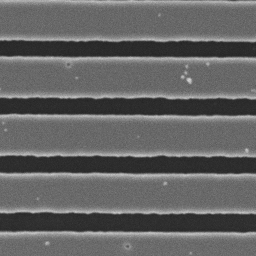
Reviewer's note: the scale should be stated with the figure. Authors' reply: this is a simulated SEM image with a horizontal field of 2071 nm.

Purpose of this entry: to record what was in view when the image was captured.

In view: lines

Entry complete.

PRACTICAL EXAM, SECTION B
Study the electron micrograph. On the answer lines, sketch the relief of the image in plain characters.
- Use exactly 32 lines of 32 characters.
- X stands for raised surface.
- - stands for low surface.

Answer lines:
XXXXXXXXXXXXXXXXXXXXXXXXXXXXXXXX
XXXXXXXXXXXXXXXXXXXXXXXXXXXXXXXX
XXXXXXXXXXXXXXXXXXXXXXXXXXXXXXXX
XXXXXXXXXXXXXXXXXXXXXXXXXXXXXXXX
XXXXXXXXXXXXXXXXXXXXXXXXXXXXXXXX
--------------------------------
--------------------------------
XXXXXXXXXXXXXXXXXXXXXXXXXXXXXXXX
XXXXXXXXXXXXXXXXXXXXXXXXXXXXXXXX
XXXXXXXXXXXXXXXXXXXXXXXXXXXXXXXX
XXXXXXXXXXXXXXXXXXXXXXXXXXXXXXXX
XXXXXXXXXXXXXXXXXXXXXXXXXXXXXXXX
--------------------------------
--------------------------------
XXXXXXXXXXXXXXXXXXXXXXXXXXXXXXXX
XXXXXXXXXXXXXXXXXXXXXXXXXXXXXXXX
XXXXXXXXXXXXXXXXXXXXXXXXXXXXXXXX
XXXXXXXXXXXXXXXXXXXXXXXXXXXXXXXX
XXXXXXXXXXXXXXXXXXXXXXXXXXXXXXXX
----XXX-------XXXXX--XXX-XX-XXXX
--------------------------------
--------------------------------
XXXXXXXXXXXXXXXXXXXXXXXXXXXXXXXX
XXXXXXXXXXXXXXXXXXXXXXXXXXXXXXXX
XXXXXXXXXXXXXXXXXXXXXXXXXXXXXXXX
XXXXXXXXXXXXXXXXXXXXXXXXXXXXXXXX
XX-XX-XXXXXXXXXXXXXXXXXXXXXXXXXX
--------------------------------
--------------------------------
XXXXXXXXXXXXXXXXXXXXXXXXXXXXXXXX
XXXXXXXXXXXXXXXXXXXXXXXXXXXXXXXX
XXXXXXXXXXXXXXXXXXXXXXXXXXXXXXXX